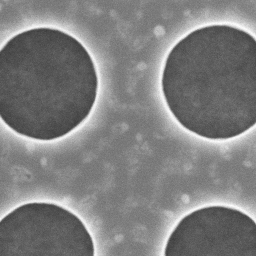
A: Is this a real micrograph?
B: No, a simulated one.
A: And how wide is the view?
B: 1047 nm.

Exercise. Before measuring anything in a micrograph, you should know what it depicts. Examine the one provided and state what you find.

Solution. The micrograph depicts holes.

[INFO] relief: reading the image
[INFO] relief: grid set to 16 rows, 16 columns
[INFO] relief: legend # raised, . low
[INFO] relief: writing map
################
################
#....######.....
......####......
......####......
......####......
......####......
.....######.....
#...#########..#
################
################
################
################
.....#######....
......#####.....
......####......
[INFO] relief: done